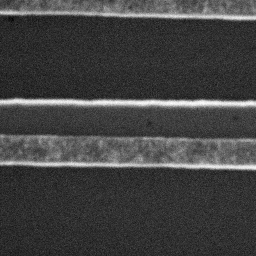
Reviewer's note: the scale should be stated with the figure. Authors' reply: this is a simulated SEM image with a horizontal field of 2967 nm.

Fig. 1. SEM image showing lines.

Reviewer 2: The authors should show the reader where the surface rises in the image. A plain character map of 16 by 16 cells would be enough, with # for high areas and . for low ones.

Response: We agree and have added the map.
################
................
................
................
................
................
#############..#
################
################
################
................
................
................
................
................
................